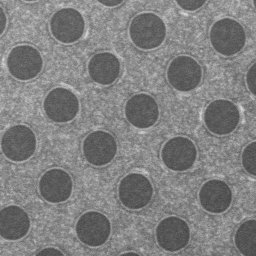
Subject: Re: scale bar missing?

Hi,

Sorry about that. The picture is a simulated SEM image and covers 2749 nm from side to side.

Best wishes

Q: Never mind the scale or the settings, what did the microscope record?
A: a regular array of raised bodies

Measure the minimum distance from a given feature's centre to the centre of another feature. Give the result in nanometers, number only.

605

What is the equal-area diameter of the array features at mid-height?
392 nanometres